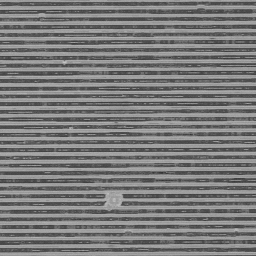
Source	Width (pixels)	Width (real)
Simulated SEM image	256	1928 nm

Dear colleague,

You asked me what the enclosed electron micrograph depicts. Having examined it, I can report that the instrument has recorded parallel lines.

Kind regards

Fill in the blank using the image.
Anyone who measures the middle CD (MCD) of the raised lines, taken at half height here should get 2.75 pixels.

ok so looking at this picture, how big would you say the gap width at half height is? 40.5 nm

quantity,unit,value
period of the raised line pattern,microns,0.0579